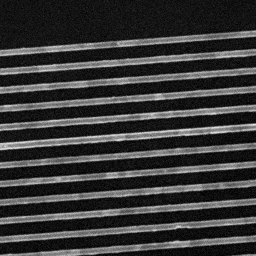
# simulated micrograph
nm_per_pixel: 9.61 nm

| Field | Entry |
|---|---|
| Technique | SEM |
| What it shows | parallel lines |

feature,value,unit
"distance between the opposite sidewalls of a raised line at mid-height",56.3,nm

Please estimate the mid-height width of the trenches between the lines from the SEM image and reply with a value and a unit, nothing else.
12.7 pixels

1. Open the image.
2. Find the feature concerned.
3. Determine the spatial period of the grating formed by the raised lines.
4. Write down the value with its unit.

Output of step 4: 179 nm